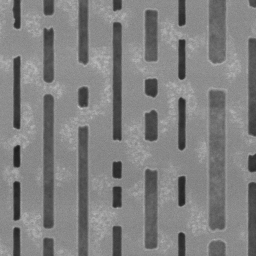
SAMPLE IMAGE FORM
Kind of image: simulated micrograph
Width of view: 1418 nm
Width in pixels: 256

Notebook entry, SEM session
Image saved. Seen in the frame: parallel lines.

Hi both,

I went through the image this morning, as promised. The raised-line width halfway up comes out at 132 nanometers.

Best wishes